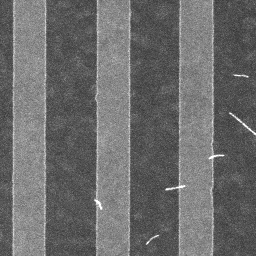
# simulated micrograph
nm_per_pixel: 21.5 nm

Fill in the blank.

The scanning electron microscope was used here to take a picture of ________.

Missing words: one or a few lines or trenches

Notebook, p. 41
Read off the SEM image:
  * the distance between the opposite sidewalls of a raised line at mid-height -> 1100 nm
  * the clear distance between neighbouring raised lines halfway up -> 683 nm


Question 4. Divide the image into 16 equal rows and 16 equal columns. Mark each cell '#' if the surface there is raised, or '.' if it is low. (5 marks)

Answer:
#..###..###..###
#..###..###..###
#..###..###..###
#..###..###..###
#..###..###..###
#..###..###..###
#..###..###..###
#..###..###..###
#..###..###..###
#..###..###..###
#..###..###..###
#..###..###..###
#..###..###..###
#..###..###..###
#..###..###..###
#..###..###..###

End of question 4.